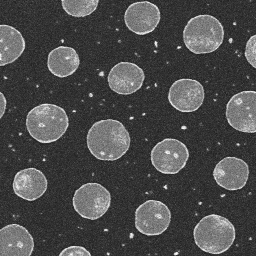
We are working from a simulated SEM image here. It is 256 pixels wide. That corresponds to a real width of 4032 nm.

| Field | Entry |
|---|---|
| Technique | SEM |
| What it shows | a regular array of raised bodies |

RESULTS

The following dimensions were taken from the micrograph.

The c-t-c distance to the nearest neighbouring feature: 63.1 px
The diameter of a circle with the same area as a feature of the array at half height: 35.2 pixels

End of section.